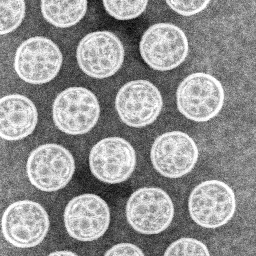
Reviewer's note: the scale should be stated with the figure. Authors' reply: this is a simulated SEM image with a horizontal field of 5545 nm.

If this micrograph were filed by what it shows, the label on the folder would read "a regular array of raised bodies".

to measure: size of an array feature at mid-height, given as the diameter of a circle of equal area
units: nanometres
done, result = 976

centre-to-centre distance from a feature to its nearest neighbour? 61.4 px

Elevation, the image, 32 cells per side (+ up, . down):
+++..++++++..+++++...+++++......
+++..+++++....++++....++........
+++...++++......................
++.................+++..........
...........+++....+++++.........
...++++...+++++...+++++.........
..+++++...+++++...+++++.........
..++++++..+++++...+++++.........
..+++++...+++++....++...........
...++++.....+...........++......
................+++....++++.....
........+++....+++++..++++++....
+++....+++++...+++++..++++++....
++++...+++++...+++++..+++++.....
++++...+++++...++++....+++......
++++...+++++....++..............
++++....++......................
.............++.....++++........
.....+++....++++...+++++........
....+++++..++++++..+++++........
....+++++..++++++..+++++........
....+++++...++++....+++.........
....+++++....++.................
.....++..................+++....
..........++.....++++...+++++...
..+++....++++...+++++...+++++...
.+++++..++++++..++++++..+++++...
++++++..++++++..+++++...++++....
++++++..+++++....+++............
.++++....+++....................
..++..................+++.......
..............+++....+++++......